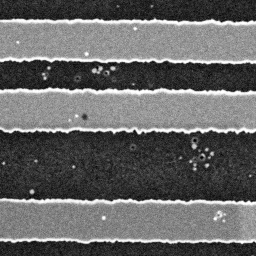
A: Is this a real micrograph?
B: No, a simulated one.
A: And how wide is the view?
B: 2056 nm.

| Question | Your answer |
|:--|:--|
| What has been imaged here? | lines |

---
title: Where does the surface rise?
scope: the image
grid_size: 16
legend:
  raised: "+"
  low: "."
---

................
++++++++++++++++
++++++++++++++++
++++++++++++++++
................
................
++++++++++++++++
++++++++++++++++
................
................
................
................
+..+............
++++++++++++++++
++++++++++++++++
................